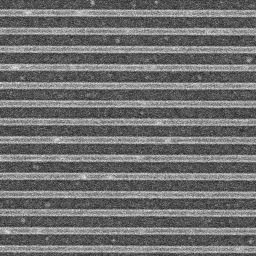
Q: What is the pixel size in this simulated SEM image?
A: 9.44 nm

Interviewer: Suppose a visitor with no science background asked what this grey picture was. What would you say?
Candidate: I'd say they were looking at parallel lines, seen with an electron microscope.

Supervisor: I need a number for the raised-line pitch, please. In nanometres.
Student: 171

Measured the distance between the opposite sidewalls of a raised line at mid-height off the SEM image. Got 54.3 nm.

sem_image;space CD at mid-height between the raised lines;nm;114